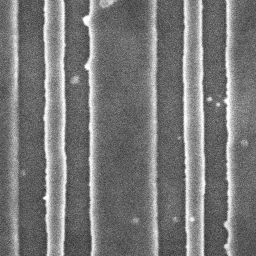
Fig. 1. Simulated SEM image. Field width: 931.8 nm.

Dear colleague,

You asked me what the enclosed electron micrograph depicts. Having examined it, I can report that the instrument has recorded lines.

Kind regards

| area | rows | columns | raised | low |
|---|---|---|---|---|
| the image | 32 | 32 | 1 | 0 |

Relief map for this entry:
11000011000111111110000110001111
11000011000111111110000110001111
11000011000111111110000110001111
11000011000111111110000110001111
11000011000111111110000110001111
11000011000111111110000110001111
11000011000111111110000110001111
11000011000111111110000110001111
11000011000111111110000110001111
11000011000111111110000110001111
11000011000111111110000110001111
11000011000111111110000110001111
11000011000111111110000110001111
11000011000111111110000110001111
11000011000111111110000110001111
11000011000111111110000110001111
11000011000111111110000110000111
11000011000111111110000110000111
11000011000111111110000110001111
11000011000111111110000110001111
11000011000111111110000110001111
11000011000111111110000110001111
11000011000111111110000111000111
11000011000111111110000111000111
11000011000111111110000110000111
11000011000111111110000110000111
11000011000111111110000110000111
11000011000111111110000110001111
11000011000111111111000110001111
11000011000111111111000110000111
11000011000011111111000110001111
11000011000111111111000110001111